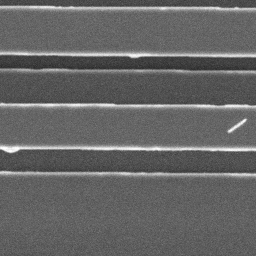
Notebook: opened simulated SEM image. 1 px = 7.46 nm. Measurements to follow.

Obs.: lines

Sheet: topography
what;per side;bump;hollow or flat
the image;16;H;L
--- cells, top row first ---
HHHHHHHHHHHHHHHL
HHHHHHHHHHHHHHHH
HHHHHHHHHHHHHHHH
LLLLLLLLLLLLLLLL
LLLLLLLLLLLLLLLL
LLLLLLLLLLLLLLLL
HLLLLLLLLLLLLLLL
HHHHHHHHHHHHHHHH
HHHHHHHHHHHHHHHH
LLLLLLLLLLLLLLLL
LLLLLLLLLLLLLLLL
LLLLLLLLLLLLLLLL
LLLLLLLLLLLLLLLL
LLLLLLLLLLLLLLLL
LLLLLLLLLLLLLLLL
LLLLLLLLLLLLLLLL